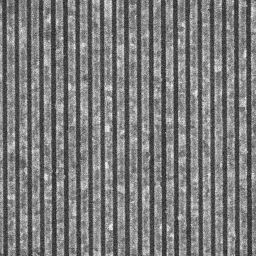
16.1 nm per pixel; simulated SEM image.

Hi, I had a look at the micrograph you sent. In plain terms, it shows parallel lines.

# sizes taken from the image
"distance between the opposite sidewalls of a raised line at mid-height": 98.5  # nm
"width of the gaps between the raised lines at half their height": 6.13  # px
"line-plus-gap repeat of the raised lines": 196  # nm